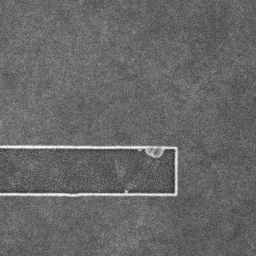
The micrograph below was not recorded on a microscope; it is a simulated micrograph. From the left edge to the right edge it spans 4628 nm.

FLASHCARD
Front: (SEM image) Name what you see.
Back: one or a few lines or trenches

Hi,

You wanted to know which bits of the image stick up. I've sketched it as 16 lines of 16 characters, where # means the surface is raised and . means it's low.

################
################
################
################
################
################
################
################
################
.........#.#####
...........#####
...........#####
################
################
################
################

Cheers